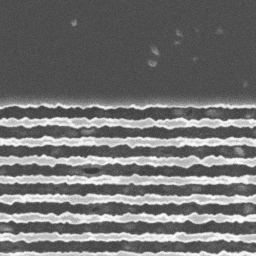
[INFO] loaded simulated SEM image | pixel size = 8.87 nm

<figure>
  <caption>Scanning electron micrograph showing parallel lines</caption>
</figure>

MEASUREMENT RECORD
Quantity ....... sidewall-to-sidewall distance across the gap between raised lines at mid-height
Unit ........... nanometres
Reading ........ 109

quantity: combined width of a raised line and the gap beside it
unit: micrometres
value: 0.169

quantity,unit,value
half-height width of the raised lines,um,0.0621